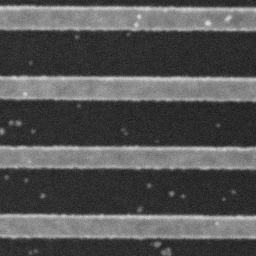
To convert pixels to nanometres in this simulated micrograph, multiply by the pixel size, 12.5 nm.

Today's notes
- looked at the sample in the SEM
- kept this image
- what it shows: lines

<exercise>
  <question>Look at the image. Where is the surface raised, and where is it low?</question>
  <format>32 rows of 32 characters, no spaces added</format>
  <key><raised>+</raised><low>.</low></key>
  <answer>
................................
++++++++++++++++++++++++++++++++
++++++++++++++++++++++++++++++++
++++++++++++++++++++++++++++++++
................................
................................
................................
................................
................................
................................
++++++++++++++++++++++++++++++++
++++++++++++++++++++++++++++++++
..............+.++++++++++++++++
................................
................................
................................
................................
................................
++++++++++++++++++++++++++++++.+
++++++++++++++++++++++++++++++++
++++++++++++++++++++++++++++++++
................................
................................
................................
................................
................................
................................
++++++++++++++++++++++++++++++++
++++++++++++++++++++++++++++++++
++++++++++++++++++++++++++++++++
................................
................................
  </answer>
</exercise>